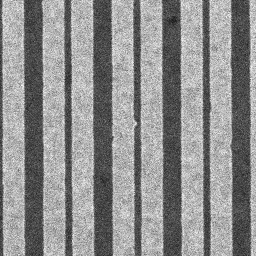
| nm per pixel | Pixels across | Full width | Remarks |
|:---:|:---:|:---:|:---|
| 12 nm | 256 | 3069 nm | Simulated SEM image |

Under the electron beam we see parallel lines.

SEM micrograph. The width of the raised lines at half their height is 250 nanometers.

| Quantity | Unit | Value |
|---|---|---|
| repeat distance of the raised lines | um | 0.414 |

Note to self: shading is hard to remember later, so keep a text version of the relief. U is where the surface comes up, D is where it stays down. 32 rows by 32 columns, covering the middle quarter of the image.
DDUUUUUDDDDDUUUUUDDUUUUUDDDDDUUU
DDUUUUUDDDDDUUUUUDDUUUUUDDDDDUUU
DDUUUUUDDDDDUUUUUDDUUUUUDDDDDUUU
DDUUUUUDDDDDUUUUUDDUUUUUDDDDDDUU
DDUUUUUDDDDDUUUUUDDUUUUUDDDDDDUU
DDUUUUUDDDDDUUUUUDDUUUUUDDDDDDUU
DDUUUUUDDDDDUUUUUDDUUUUUDDDDDDUU
DDUUUUUDDDDDUUUUUDDUUUUUDDDDDUUU
DDUUUUUDDDDDUUUUUDDUUUUUDDDDDUUU
DDUUUUUDDDDDUUUUUDDUUUUUDDDDDDUU
DDUUUUUDDDDDUUUUUDDUUUUUDDDDDDUU
DDUUUUUDDDDDUUUUUDDUUUUUDDDDDUUU
DDUUUUUDDDDDUUUUUDDUUUUUDDDDDUUU
DDUUUUUDDDDDUUUUUDDUUUUUDDDDDUUU
DDUUUUUDDDDDUUUUUUDUUUUUUDDDDUUU
DDUUUUUDDDDDUUUUUUDUUUUUUDDDDDUU
DDUUUUUDDDDDUUUUUDDUUUUUDDDDDDUU
DDUUUUUDDDDDUUUUUDDUUUUUDDDDDDUU
DDUUUUUDDDDDDUUUUDDUUUUUDDDDDDUU
DDUUUUUDDDDDUUUUUDDUUUUUDDDDDDUU
DDUUUUUDDDDDUUUUUDDUUUUUDDDDDDUU
DDUUUUUDDDDDUUUUUDDUUUUUUDDDDDUU
DDUUUUUDDDDDUUUUUDDUUUUUUDDDDDUU
DDUUUUUDDDDDUUUUUDDDUUUUUDDDDDUU
DDUUUUUDDDDDUUUUUDDDUUUUUDDDDDUU
DDUUUUUDDDDDUUUUUDDDUUUUUDDDDDUU
DDUUUUUDDDDDUUUUUDDDUUUUUDDDDDUU
DDUUUUUDDDDDUUUUUDDDUUUUDDDDDDUU
DDUUUUUDDDDDUUUUUDDDUUUUDDDDDDUU
DDUUUUUDDDDDUUUUUDDDUUUUUDDDDDUU
DDUUUUUDDDDDUUUUUDDDUUUUUDDDDDUU
DDUUUUUDDDDDUUUUUDDDUUUUUDDDDDUU